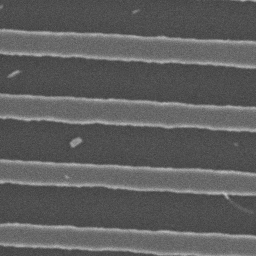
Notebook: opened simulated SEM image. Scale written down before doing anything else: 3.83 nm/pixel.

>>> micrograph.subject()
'lines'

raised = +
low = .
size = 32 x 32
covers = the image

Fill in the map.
................................
................................
................................
................................
+++++++++++++++++...............
++++++++++++++++++++++++++++++++
++++++++++++++++++++++++++++++++
...............+++++++++++++++++
................................
................................
................................
................................
+++++++++++++++.................
++++++++++++++++++++++++++++++++
++++++++++++++++++++++++++++++++
..........+..+++++++++++++++++++
................................
................................
................................
................................
++++++++++......................
+++++++++++++++++++++++++++++++.
++++++++++++++++++++++++++++++++
..............++++++++++++++++++
................................
................................
................................
................................
++++++++++......................
++++++++++++++++++++++++++++++++
++++++++++++++++++++++++++++++++
.................+++++++++++++++